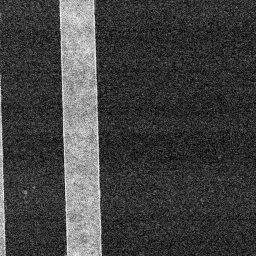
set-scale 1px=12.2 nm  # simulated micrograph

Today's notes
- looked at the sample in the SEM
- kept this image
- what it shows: one or a few lines or trenches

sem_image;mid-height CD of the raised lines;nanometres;413